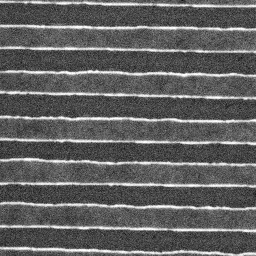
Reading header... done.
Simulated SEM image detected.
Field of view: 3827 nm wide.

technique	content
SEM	lines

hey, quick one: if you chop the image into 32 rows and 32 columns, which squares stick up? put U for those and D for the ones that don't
DDDDDDDDDDDDUUUUUUUUUUUUUUUUUUUU
DDDDDDDDDDDDDDDDDDDDDDDDDDDDDDDD
DDDDDDDDDDDDDDDDDDDDDDDDDDDDDDDD
UUUUUUUUUUUUUUUUUUUUUUUUUDDDDDDD
UUUUUUUUUUUUUUUUUUUUUUUUUUUUUUUU
UUUUUUUUUUUUUUUUUUUUUUUUUUUUUUUU
DDDDDDDDDDDDDDDDDDDDDDDDDDDDDDDD
DDDDDDDDDDDDDDDDDDDDDDDDDDDDDDDD
DDDDDDDDDDDDDDDDDDDDDDDDDDDDDDDD
UUUUUUUUUUUUUUUUUUUUUUUUUUUUUUUU
UUUUUUUUUUUUUUUUUUUUUUUUUUUUUUUU
UUUUUUUUUUUUUUUUUUUUUUUUUUUUUUUU
DDDDDDDDDDDDDDDDDDDDDDDDDDDDDDDD
DDDDDDDDDDDDDDDDDDDDDDDDDDDDDDDD
DDDDDDDDDDDDDDDDDDDDDDDDDDDDDDDD
UUUUUUUUUUUUUUUUUUUUUUUUUUUUUUUU
UUUUUUUUUUUUUUUUUUUUUUUUUUUUUUUU
DDUUUUUUUUUUUUUUUUUUUUUUUUUUUUUU
DDDDDDDDDDDDDDDDDDDDDDDDDDDDDDDD
DDDDDDDDDDDDDDDDDDDDDDDDDDDDDDDD
UUUUUUUUUUUUUUUUUUUUUUUUUUUUDDDD
UUUUUUUUUUUUUUUUUUUUUUUUUUUUUUUU
UUUUUUUUUUUUUUUUUUUUUUUUUUUUUUUU
DDDDDDDDDDDDDDDDDDDDDDDDDDDDDDDD
DDDDDDDDDDDDDDDDDDDDDDDDDDDDDDDD
UUUUUDDDDDDDDDDDDDDDDDDDDDDDDDDD
UUUUUUUUUUUUUUUUUUUUUUUUUUUUUUUU
UUUUUUUUUUUUUUUUUUUUUUUUUUUUUUUU
DDDDDDDDDDUDUUUUUUUUUUUUUUUUUUUU
DDDDDDDDDDDDDDDDDDDDDDDDDDDDDDDD
DDDDDDDDDDDDDDDDDDDDDDDDDDDDDDDD
UUUUUUUUUUUUUUUUUUDDDUUUUDDDDDDD